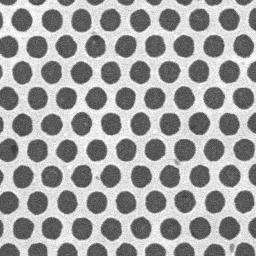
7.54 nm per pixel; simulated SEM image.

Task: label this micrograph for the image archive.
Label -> a regular array of holes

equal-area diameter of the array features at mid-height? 171 nanometres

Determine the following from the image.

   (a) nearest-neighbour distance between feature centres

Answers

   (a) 0.22 µm